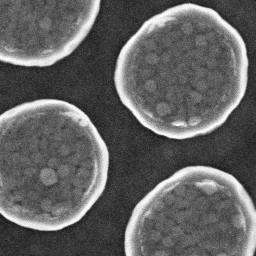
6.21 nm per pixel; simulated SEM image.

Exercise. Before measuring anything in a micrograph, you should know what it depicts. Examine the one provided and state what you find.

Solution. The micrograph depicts raised bodies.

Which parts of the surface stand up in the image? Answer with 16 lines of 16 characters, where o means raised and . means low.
oooooo.....o....
oooooo...ooooo..
ooooo...ooooooo.
oooo....ooooooo.
.......oooooooo.
........ooooooo.
..oo....ooooooo.
ooooo....ooooo..
oooooo..........
ooooooo.........
ooooooo.........
oooooo....ooooo.
oooooo...oooooo.
ooooo...oooooooo
........oooooooo
........oooooooo